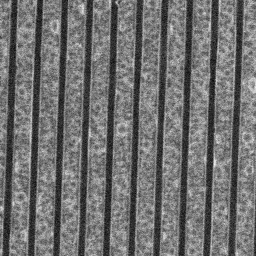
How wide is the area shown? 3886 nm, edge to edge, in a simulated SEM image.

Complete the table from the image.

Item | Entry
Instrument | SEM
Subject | parallel lines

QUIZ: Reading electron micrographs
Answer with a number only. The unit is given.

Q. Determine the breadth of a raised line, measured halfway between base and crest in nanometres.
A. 273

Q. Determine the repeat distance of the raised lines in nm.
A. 380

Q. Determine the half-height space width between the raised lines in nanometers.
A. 110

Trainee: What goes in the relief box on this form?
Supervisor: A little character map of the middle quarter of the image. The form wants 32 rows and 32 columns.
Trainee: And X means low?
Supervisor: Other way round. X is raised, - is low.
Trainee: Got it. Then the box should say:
-XXXX--XXXX--XXXX---XXXX--XXXX--
-XXXX--XXXX--XXXX--XXXXX--XXXX--
-XXXX--XXXX--XXXX--XXXXX--XXXX--
-XXXX--XXXX--XXXX--XXXX---XXXX--
-XXXX--XXXX--XXXX--XXXX---XXXX--
-XXXX--XXXX--XXXX--XXXX---XXXX--
-XXXX--XXXX--XXXX--XXXX---XXXX--
XXXXX--XXXX--XXXX--XXXX---XXXX--
XXXXX--XXXX--XXXX--XXXX--XXXXX--
XXXX---XXXX--XXXX--XXXX--XXXXX--
XXXX--XXXXX--XXXX--X--X--XXXXX--
XXXX--XXXXX--XXXX--XX-X--XXXXX--
XXXX--XXXXX--XXXX--XXXX--XXXXX--
XXXX--XXXXX--XXXX--XXXX--XXXX---
XXXX--XXXXX--XXXX--XXXX--XXXX--X
XXXX--XXXXX--XXXX--XXXX--XXXX--X
XXXX--XXXXX--XXXX--XXXX--XXXX--X
XXXX--XXXXX--XXXX--XXXX--XXXX--X
XXXX--XXXXX--XXXX--XXXX--XXXX--X
XXXX--XXXX---XXXX--XXXX--XXXX--X
XXXX--XXXX--XXXXX--XXXX--XXXX--X
XXXX--XXXX--XXXXX--XXXX--XXXX--X
XXXX--XXXX--XXXXX--XXXX--XXXX--X
XXXX--XXXX--XXXXX--XXXX--XXXX--X
XXXX--XXXX--XXXXX--XXXX--XXXX--X
XXXX--XXXX--XXXXX--XXXX--XXXX--X
XXXX--XXXX--XXXXX--XXXX--XXXX--X
XXXX--XXXX--XXXXX--XXXX--XXXX--X
XXXX--XXXX--XXXXX--XXXX--XXXX--X
XXXX--XX-X--XXXX---XXXX--XXXX--X
XXXX--XXXX--XXXX--XXXXX--XXXX--X
XXXX--XXXX--XXXX--XXXXX--XXXX--X